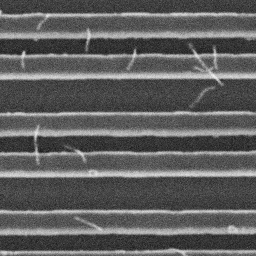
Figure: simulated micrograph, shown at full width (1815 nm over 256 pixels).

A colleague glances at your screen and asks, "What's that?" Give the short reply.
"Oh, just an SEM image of lines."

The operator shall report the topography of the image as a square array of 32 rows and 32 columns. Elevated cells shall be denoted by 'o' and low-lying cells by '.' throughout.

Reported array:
................................
................................
oooooooooooooooooooooooooooooooo
oooooooooooooooooooooooooooooooo
oooooooooooooooo.ooooooo........
................................
................................
oooooooooooooooooooooooooooooooo
oooooooooooooooooooooooooooooooo
oooooooooooooooooooooooooooooooo
................................
................................
................................
................................
oooooooooooooooooooooooooooooooo
oooooooooooooooooooooooooooooooo
oooooooooooooooooooooooooooooooo
................................
................................
oooooooooooooooooooooooooooooooo
oooooooooooooooooooooooooooooooo
oooooooooooooooooooooooooooooooo
................................
................................
................................
................................
oooooooooooooooooooooooooooooooo
oooooooooooooooooooooooooooooooo
oooooooooooooooooooooooooooooooo
................................
................................
oooooooooooooooooooooooooooooooo